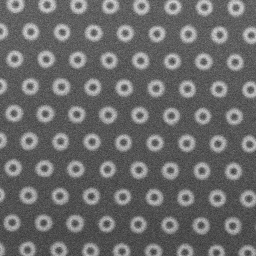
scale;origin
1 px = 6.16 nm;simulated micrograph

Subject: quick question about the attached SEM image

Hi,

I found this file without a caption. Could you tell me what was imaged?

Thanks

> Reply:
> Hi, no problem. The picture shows an array of small figures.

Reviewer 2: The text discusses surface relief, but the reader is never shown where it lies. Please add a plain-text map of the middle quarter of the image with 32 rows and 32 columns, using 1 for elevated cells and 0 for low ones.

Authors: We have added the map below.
00111000001110000011100001111000
00000000000000000000000000000000
00000000000000000000000000000000
00000000000000000000000000000000
10000011100001110000001100000011
10000111100001111000011110000111
10000111100001111000011110000111
00000011000000111000011100000111
00000000000000000000000000000000
00000000000000000000000000000000
00000000000000000000000000000000
01111000011110000111000000110000
01111000011110000111100001111000
01111000011110000111100001111000
00110000001100000011000001110000
00000000000000000000000000000000
00000000000000000000000000000000
00000010000000000000000000000000
10000111100001110000011100000111
10000111100001111000011110000111
10000111100001111000011110000111
00000000000000110000001100000111
00000000000000000000000000000000
00000000000000000000000000000000
00110000001100000010000000000000
01111000011110000111000001110000
01111000011110000111100001111000
01111000011100000111100001110000
00000000000000000010000001110000
00000000000000000000000000000000
00000000000000000000000000000000
00000011000000110000001100000010